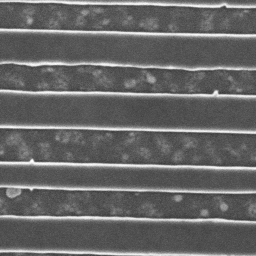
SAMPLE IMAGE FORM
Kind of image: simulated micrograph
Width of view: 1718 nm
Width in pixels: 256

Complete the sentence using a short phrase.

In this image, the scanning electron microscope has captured one or a few lines or trenches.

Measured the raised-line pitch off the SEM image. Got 422 nm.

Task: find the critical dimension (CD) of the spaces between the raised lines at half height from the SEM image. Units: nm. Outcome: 189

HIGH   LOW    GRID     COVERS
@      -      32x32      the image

---------------@@@--@@@@@@@@@@@@
--------------------------------
--------------------------------
--------------------------------
@@@@@@@@@@@@@@@@@@@@@@@@@@@@@@@@
@@@@@@@@@@@@@@@@@@@@@@@@@@@@@@@@
@@@@@@@@@@@@@@@@@@@@@@@@@@@@@@@@
@@@@@@@@@@@@@@@@@@@@@@@@@@@@@@@@
--------------------@@@@@@@@@@@@
--------------------------------
--------------------------------
@@@-----------------------------
@@@@@@@@@@@@@@@@@@@@@@@@@@@@@@@@
@@@@@@@@@@@@@@@@@@@@@@@@@@@@@@@@
@@@@@@@@@@@@@@@@@@@@@@@@@@@@@@@@
@@@@@@@@@@@@@@@@@@@@@@@@@@@@@@@@
-----------------------------@@@
--------------------------------
--------------------------------
--------------------------------
@@@@@@@@------------------------
@@@@@@@@@@@@@@@@@@@@@@@@@@@@@@@@
@@@@@@@@@@@@@@@@@@@@@@@@@@@@@@@@
---@@@@@@@@@@@@@@@@@@@@@@@@@@@@@
--------------------------------
--------------------------------
--------------------------------
@@@@@@@@@@@@@@@@@@@@@@@@@-@@----
@@@@@@@@@@@@@@@@@@@@@@@@@@@@@@@@
@@@@@@@@@@@@@@@@@@@@@@@@@@@@@@@@
@@@@@@@@@@@@@@@@@@@@@@@@@@@@@@@@
----@@--@@@@@@@@@@@@@@@@@@@@@@@@